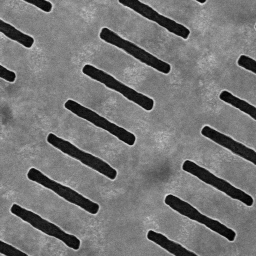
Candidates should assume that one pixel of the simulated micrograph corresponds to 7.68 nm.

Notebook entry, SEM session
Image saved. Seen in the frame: a regular array of holes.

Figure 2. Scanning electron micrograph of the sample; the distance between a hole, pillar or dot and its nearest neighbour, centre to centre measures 300 nm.